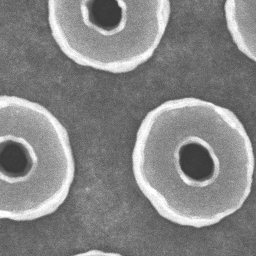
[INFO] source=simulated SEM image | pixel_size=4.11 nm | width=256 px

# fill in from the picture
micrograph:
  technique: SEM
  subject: ring-shaped raised bodies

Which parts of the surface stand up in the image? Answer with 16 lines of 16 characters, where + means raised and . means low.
...+++..++....++
...+++.+++....++
....++++++.....+
.....++++.......
................
................
++........+++...
+++......++++++.
++++.....++++++.
..++.....++..+++
..++....+++..+++
++++.....+++++++
++++......+++++.
++.........+++..
................
................